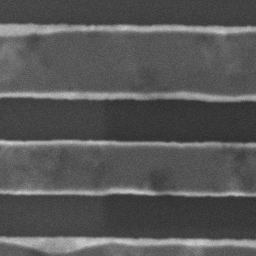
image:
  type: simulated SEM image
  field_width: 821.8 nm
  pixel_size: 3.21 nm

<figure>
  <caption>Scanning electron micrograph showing lines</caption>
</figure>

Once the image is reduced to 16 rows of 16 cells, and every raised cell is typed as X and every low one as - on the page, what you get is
----------------
----------------
XXXXXXXXXXXXXXXX
XXXXXXXXXXXXXXXX
XXXXXXXXXXXXXXXX
XXXXXXXXXXXXXXXX
----------------
----------------
----------------
XXXXXXXXXXXXXXXX
XXXXXXXXXXXXXXXX
XXXXXXXXXXXXXXXX
----------------
----------------
----------------
XXXXXXXXXXXXXXXX